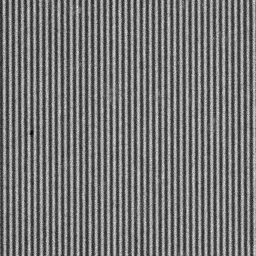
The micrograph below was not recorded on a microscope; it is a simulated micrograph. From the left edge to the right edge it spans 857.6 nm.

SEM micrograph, parallel lines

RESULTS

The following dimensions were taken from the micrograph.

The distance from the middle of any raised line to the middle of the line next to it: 20.4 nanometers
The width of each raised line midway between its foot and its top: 5.9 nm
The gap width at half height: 13.4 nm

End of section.